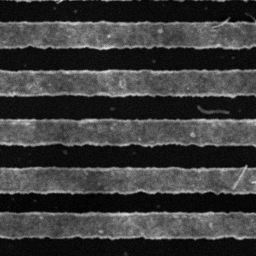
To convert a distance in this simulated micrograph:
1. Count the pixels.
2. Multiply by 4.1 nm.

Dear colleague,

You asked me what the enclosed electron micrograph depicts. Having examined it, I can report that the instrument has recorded lines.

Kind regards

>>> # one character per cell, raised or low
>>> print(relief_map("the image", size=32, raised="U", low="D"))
DDDDDDDDDDDDDDDDDDDDDDDDDDDDDDDD
DDDDDDDDDDDDDDDDDDDDDDDDDDDDDDDD
DDDDDDDDDDDDDDDDDDDDDDDDDDDDDDDD
UUUUUUUUUUUUUUUUUUUUUUUUUUUUUUUU
UUUUUUUUUUUUUUUUUUUUUUUUUUUUUUUU
UUUUUUUUUUUUUUUUUUUUUUUUUUUUUUUU
DDDDDDDDDDDDDDDDDDDDDDDDDDDDDDDD
DDDDDDDDDDDDDDDDDDDDDDDDDDDDDDDD
DDDDDDDDDDDDDDDDDDDDDDDDDDDDDDDD
UUUUUUUUUUUUUUUUUUUUUUUUUUUUUUUU
UUUUUUUUUUUUUUUUUUUUUUUUUUUUUUUU
UUUUUUUUUUUUUUUUUUUUUUUUUUUUUUUU
DDDDDDDDDDDDDDDDDDDDDDDDDDDDDDDD
DDDDDDDDDDDDDDDDDDDDDDDDDDDDDDDD
DDDDDDDDDDDDDDDDDDDDDDDDDDDDDDDD
UUUUUUUUUUUUUUUUUUUUUUUUUUUUUUUU
UUUUUUUUUUUUUUUUUUUUUUUUUUUUUUUU
UUUUUUUUUUUUUUUUUUUUUUUUUUUUUUUU
DDDDDDDDDDDDDDDDDDDDDDDDDDDDDDDD
DDDDDDDDDDDDDDDDDDDDDDDDDDDDDDDD
DDDDDDDDDDDDDDDDDDDDDDDDDDDDDDDD
UUUUUUUUUUUUUUUUUUUUUUUUUUUUUUUU
UUUUUUUUUUUUUUUUUUUUUUUUUUUUUUUU
UUUUUUUUUUUUUUUUUUUUUUUUUUUUUUUU
DDDDDDDDDDDDDDDDDDDDDDDDDDDDDDDD
DDDDDDDDDDDDDDDDDDDDDDDDDDDDDDDD
DDDDDDDDDDDDDDDDDDDDDDDDDDDDDDDD
UUUUUUUUUUUUUUUUUUUUUUUUUUUUUUUU
UUUUUUUUUUUUUUUUUUUUUUUUUUUUUUUU
UUUUUUUUUUUUUUUUUUUUUUUUUUUUUUUU
DDDDDDDDDDDDDDDDDDDDDDDDDDDDDDDD
DDDDDDDDDDDDDDDDDDDDDDDDDDDDDDDD